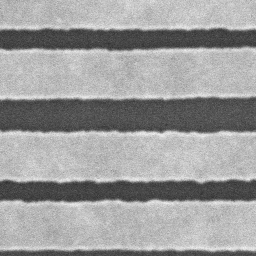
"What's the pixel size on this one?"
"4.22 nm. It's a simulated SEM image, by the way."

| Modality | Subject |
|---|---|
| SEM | lines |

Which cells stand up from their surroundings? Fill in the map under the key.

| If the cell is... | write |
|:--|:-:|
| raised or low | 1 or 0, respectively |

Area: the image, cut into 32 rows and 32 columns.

11111111111111111111111111111111
11111111111111111111111111111111
11111111111111111111111111111111
11111011101111111111111111001111
00000000000000000000000000000000
00000000000000000000000000000000
11111111111111111111111111111111
11111111111111111111111111111111
11111111111111111111111111111111
11111111111111111111111111111111
11111111111111111111111111111111
11111111111111111111111111111111
00000000000000000000000000000000
00000000000000000000000000000000
00000000000000000000000000000000
00000000000000000000000000000000
01100000001110100100010000011000
11111111111111111111111111111111
11111111111111111111111111111111
11111111111111111111111111111111
11111111111111111111111111111111
11111111111111111111111111111111
01111111111111101111101011110010
00000000000000000000000000000000
00000000000000000000000000000000
11111111111111111111111111111111
11111111111111111111111111111111
11111111111111111111111111111111
11111111111111111111111111111111
11111111111111111111111111111111
11111111111111111111111111111111
00000000000000000000000000000000